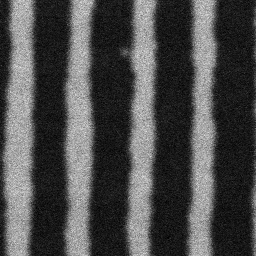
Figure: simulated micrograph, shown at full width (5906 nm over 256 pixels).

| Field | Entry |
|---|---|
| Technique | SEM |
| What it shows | one or a few lines or trenches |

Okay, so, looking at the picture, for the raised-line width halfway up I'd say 911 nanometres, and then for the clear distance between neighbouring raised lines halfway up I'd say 456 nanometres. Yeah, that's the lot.